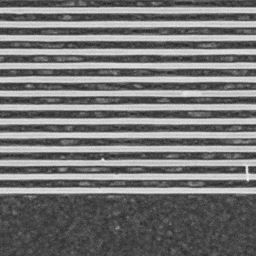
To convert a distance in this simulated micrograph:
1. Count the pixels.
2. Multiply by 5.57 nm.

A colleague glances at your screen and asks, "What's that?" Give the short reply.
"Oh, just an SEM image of parallel lines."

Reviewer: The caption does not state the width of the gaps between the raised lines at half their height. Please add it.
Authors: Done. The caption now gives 48.1 nm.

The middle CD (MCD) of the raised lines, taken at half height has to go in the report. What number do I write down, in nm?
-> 29.3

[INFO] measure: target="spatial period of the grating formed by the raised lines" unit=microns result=0.0772